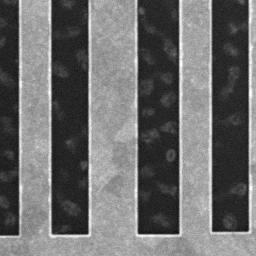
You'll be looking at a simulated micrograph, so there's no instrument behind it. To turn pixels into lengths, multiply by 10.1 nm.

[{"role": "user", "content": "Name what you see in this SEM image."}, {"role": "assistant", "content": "one or a few lines or trenches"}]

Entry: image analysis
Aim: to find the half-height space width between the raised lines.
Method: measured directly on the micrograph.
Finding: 394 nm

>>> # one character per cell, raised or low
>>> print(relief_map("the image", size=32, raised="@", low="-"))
---@@@-----@@@@@@------@@@-----@
---@@@-----@@@@@@------@@@-----@
---@@@-----@@@@@@------@@@-----@
---@@@-----@@@@@@------@@@-----@
---@@@-----@@@@@@------@@@-----@
---@@@-----@@@@@@------@@@-----@
---@@@-----@@@@@@------@@@-----@
---@@@-----@@@@@@------@@@-----@
---@@@-----@@@@@@------@@@-----@
---@@@-----@@@@@@------@@@-----@
---@@@-----@@@@@@------@@@-----@
---@@@-----@@@@@@------@@@-----@
---@@@-----@@@@@@------@@@-----@
---@@@-----@@@@@@------@@@-----@
---@@@-----@@@@@@------@@@-----@
---@@@-----@@@@@@------@@@-----@
---@@@-----@@@@@@------@@@-----@
---@@@-----@@@@@@------@@@-----@
---@@@-----@@@@@@------@@@-----@
---@@@-----@@@@@@------@@@-----@
---@@@-----@@@@@@------@@@-----@
---@@@-----@@@@@@------@@@-----@
---@@@-----@@@@@@------@@@-----@
---@@@-----@@@@@@------@@@-----@
---@@@-----@@@@@@------@@@-----@
---@@@-----@@@@@@------@@@-----@
---@@@-----@@@@@@------@@@-----@
---@@@-----@@@@@@------@@@-----@
---@@@-----@@@@@@------@@@-----@
--@@@@@----@@@@@@@----@@@@@@@@@@
@@@@@@@@@@@@@@@@@@@@@@@@@@@@@@@@
@@@@@@@@@@@@@@@@@@@@@@@@@@@@@@@@